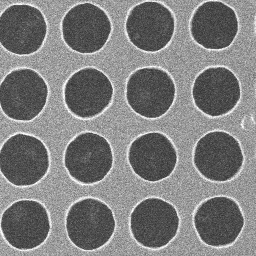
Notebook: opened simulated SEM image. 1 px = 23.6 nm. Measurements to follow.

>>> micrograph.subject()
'a regular array of holes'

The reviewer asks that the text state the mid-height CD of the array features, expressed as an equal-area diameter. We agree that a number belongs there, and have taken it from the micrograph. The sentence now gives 1.16 micrometres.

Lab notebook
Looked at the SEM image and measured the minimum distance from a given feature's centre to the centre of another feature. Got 1.51 um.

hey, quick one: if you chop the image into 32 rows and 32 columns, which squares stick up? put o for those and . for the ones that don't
oooooooooo.oooooo...ooooo...oooo
.....ooo.....ooo.....ooo.....ooo
......oo......oo......oo......oo
......oo......oo......oo......oo
......oo......oo.....ooo.....ooo
.....ooo.....oooo....oooo....ooo
o...oooooo..oooooooooooooooooooo
oooooooooooooooooooooooooooooooo
ooooooooooo.oooooo..oooooo..oooo
o....oooo....ooo.....oooo....ooo
......oo......oo......oo......oo
......oo......oo......oo......oo
......oo......oo......oo......oo
.....oooo....oooo....oooo....ooo
o....ooooo..oooooo..oooooooooooo
oooooooooooooooooooooooooooooooo
oooooooooooooooooooooooooooooooo
o....oooo....oooo....oooo.....oo
......oo......oo......oo......oo
......oo......oo......oo......oo
......oo......oo......oo......oo
......ooo....oooo.....ooo.....oo
o....ooooo...ooooo..oooooo..oooo
oooooooooooooooooooooooooooooooo
oooooooooooooooooooooooooooooooo
oo...oooo....oooo....oooo.....oo
o.....ooo.....ooo.....oo......oo
......oo......oo......oo......oo
......oo......oo......oo......oo
o.....ooo.....ooo.....ooo.....oo
o....oooo....ooooo...ooooo...ooo
oooooooooooooooooooooooooooooooo